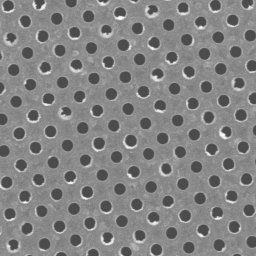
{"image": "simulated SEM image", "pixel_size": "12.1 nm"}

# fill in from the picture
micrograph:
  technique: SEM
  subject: a regular array of holes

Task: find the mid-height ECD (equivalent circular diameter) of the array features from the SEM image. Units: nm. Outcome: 139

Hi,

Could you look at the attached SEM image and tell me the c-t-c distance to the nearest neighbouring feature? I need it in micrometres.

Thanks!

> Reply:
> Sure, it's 0.264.